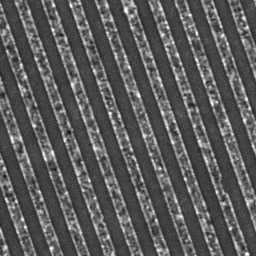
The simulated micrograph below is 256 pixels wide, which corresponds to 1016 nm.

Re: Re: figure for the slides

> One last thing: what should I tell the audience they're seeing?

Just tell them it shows parallel lines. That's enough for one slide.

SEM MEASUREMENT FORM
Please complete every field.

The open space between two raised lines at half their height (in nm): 60.3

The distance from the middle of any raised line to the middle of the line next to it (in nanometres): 99.6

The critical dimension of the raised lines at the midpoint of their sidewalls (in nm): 37.8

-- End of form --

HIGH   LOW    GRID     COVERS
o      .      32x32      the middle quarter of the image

ooo....ooo....oo....ooo....oo...
.oo....ooo....ooo....oo....ooo..
.ooo....oo.....oo....ooo....oo..
.ooo....ooo....oo....ooo....ooo.
..oo....ooo....ooo....oo....ooo.
..ooo....oo.....oo....ooo....oo.
..ooo....ooo....oo....ooo....ooo
...oo....ooo....ooo....oo....ooo
...ooo....oo....ooo....ooo....oo
...ooo....ooo....oo.....oo....oo
....oo.....oo....ooo....oo....oo
....ooo....oo....ooo....ooo....o
....ooo....ooo....oo.....oo....o
o....oo.....oo....ooo....oo.....
o....ooo....oo.....oo....ooo....
o....ooo....ooo....oo.....oo....
oo....ooo....oo....ooo....ooo...
oo....ooo....ooo....oo....ooo...
ooo....oo....ooo....ooo....oo...
ooo....ooo....oo.....oo....ooo..
.oo....ooo....ooo....oo....ooo..
.ooo....oo....ooo....ooo....oo..
.ooo....ooo....oo.....oo....ooo.
..oo....ooo....ooo....oo.....oo.
..ooo....oo....ooo....ooo....oo.
..ooo....ooo....oo....ooo....ooo
...oo....ooo....ooo....oo.....oo
...ooo....oo.....oo....ooo....oo
....oo....ooo....oo.....oo....oo
....oo....ooo....ooo....oo.....o
....ooo....ooo....oo....ooo....o
o....oo....ooo....oo.....oo....o